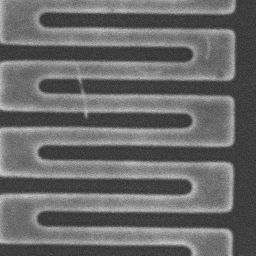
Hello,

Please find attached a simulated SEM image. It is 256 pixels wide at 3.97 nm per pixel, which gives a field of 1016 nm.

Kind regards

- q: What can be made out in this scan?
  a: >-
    groups of lines, slits or small figures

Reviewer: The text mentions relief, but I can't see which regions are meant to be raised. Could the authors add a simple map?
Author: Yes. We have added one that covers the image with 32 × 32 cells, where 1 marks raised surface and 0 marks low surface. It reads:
11111111111111111111111111111000
11111100111111111111111111111000
11111000000000000000000000000000
11111100000000000000000000000000
11111111111111111111111111111000
00011111111111111111111111111000
00000000000000000000000011111000
00000000000000000000000011111000
11111111111111111111111111111000
11111111111111111111111111111000
11111000000000000000000000000000
11111000000000000000000000000000
11111111111111111111111111111000
11111111111111111111111111111000
00000000000000000000000011111000
00000000000000000000000011111000
11111111111111111111111111111000
11111111111111111111111111111000
11111000000000000000000000000000
11111000000000000000000000000000
11111111111111111111111111111000
11111111111111111111111111111000
00000000000000000000000011111000
00000000000000000000000011111000
11111111111111111110000111111000
11111111111111111111111111111000
11111000000000000000000000000000
11111000000000000000000000000000
11111111111111110000000000000000
11111111111111111111111111111000
00000000000011111110001111111000
00000000000000000000000011111000